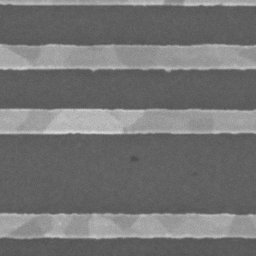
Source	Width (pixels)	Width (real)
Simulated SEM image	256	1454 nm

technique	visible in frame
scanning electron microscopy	lines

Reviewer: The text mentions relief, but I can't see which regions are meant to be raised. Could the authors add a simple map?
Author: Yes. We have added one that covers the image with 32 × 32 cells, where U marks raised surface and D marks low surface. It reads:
DUUUUUUUUUUUUUUUUUUUUUUUUUUUUUUU
DDDDDDDDDDDDDDDDDDDDDDDDDDDDDDDD
DDDDDDDDDDDDDDDDDDDDDDDDDDDDDDDD
DDDDDDDDDDDDDDDDDDDDDDDDDDDDDDDD
DDDDDDDDDDDDDDDDDDDDDDDDDDDDDDDD
DDDDDDDDDDDDDDDDDDDDDDDDDDDDDDDD
UUUUUUUUUUUUUUUUUUUUUUUUUUUUUUUU
UUUUUUUUUUUUUUUUUUUUUUUUUUUUUUUU
UUUUUUUUUUUUUUUUUUUUUUUUUUUUUUUU
DDDDDDDDDDDDDDDDDDDDDDDDDDDDDDDD
DDDDDDDDDDDDDDDDDDDDDDDDDDDDDDDD
DDDDDDDDDDDDDDDDDDDDDDDDDDDDDDDD
DDDDDDDDDDDDDDDDDDDDDDDDDDDDDDDD
DDDDDDDDDDDDDDDDDDDDDDDDDDDDDDDD
UUUUUUUUUUUUUUUUUUUUUUUUUUUUUUUU
UUUUUUUUUUUUUUUUUUUUUUUUUUUUUUUU
UUUUUUUUUUUUUUUUUUUUUUUUUUUUUUUU
DDDDDDDDDDDDDDDDDDDDDDDDDDDDDDDD
DDDDDDDDDDDDDDDDDDDDDDDDDDDDDDDD
DDDDDDDDDDDDDDDDDDDDDDDDDDDDDDDD
DDDDDDDDDDDDDDDDDDDDDDDDDDDDDDDD
DDDDDDDDDDDDDDDDDDDDDDDDDDDDDDDD
DDDDDDDDDDDDDDDDDDDDDDDDDDDDDDDD
DDDDDDDDDDDDDDDDDDDDDDDDDDDDDDDD
DDDDDDDDDDDDDDDDDDDDDDDDDDDDDDDD
DDDDDDDDDDDDDDDDDDDDDDDDDDDDDDDD
DDDDDDDDDDDDDDDDDDDDDDDDDDDDDDDD
UUUUUUUUUUUUUUUUUUUUUUUUUUUUUUUU
UUUUUUUUUUUUUUUUUUUUUUUUUUUUUUUU
UUUUUUUUUUUUUUUUUUUUUUUUUUUUUUUU
DDDDDDDDDDDDDDDDDDDDDDDDDDDDDDDD
DDDDDDDDDDDDDDDDDDDDDDDDDDDDDDDD